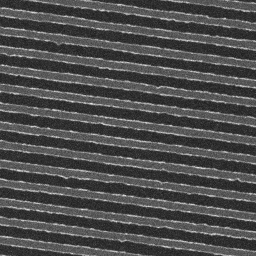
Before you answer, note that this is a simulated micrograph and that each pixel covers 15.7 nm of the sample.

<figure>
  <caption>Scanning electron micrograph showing parallel lines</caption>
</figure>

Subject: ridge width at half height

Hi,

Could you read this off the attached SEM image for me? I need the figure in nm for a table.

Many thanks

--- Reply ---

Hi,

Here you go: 187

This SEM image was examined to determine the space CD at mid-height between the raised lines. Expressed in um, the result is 0.105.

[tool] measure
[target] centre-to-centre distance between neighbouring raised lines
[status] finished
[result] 0.296 µm